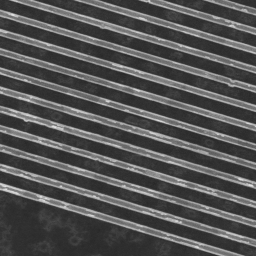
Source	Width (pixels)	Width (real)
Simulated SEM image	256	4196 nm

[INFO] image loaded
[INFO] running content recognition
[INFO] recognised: parallel lines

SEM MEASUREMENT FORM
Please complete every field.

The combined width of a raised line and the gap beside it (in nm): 302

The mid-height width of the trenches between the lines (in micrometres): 0.216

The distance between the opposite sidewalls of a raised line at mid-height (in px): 5.39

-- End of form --